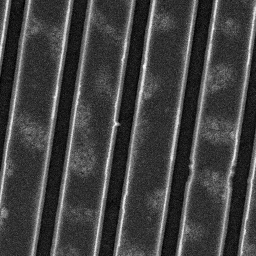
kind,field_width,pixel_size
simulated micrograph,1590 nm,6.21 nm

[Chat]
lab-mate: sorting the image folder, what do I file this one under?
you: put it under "one or a few lines or trenches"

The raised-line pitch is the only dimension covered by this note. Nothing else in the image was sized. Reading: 383 nm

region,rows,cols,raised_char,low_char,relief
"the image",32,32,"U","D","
UDDUUUUUUDDUUUUUUDDUUUUUDDDUUUUU
UDDUUUUUUDDUUUUUUDDUUUUUDDDUUUUU
UDDUUUUUUDDUUUUUDDDUUUUUDDDUUUUU
UDDUUUUUDDDUUUUUDDDUUUUUDDUUUUUU
UDDUUUUUDDDUUUUUDDUUUUUUDDUUUUUU
DDDUUUUUDDUUUUUUDDUUUUUUDDUUUUUD
DDDUUUUUDDUUUUUUDDUUUUUUDDUUUUUD
DDUUUUUUDDUUUUUUDDUUUUUDDDUUUUUD
DDUUUUUUDDUUUUUDDDUUUUUDDDUUUUUD
DDUUUUUDDDUUUUUDDDUUUUUDDDUUUUUD
DDUUUUUDDDUUUUUDDDUUUUUDDUUUUUUD
DDUUUUUDDDUUUUUDDUUUUUUDDUUUUUUD
DDUUUUUDDUUUUUUDDUUUUUUDDUUUUUDD
DUUUUUUDDUUUUUUDDUUUUUUDDUUUUUDD
DUUUUUUDDUUUUUUDDUUUUUDDDUUUUUDD
DUUUUUUDDUUUUUUDDUUUUUDDDUUUUUDD
DUUUUUUDDUUUUUDDDUUUUUDDUUUUUUDD
DUUUUUDDDUUUUUDDUUUUUUDDUUUUUUDD
DUUUUUDDDUUUUUDDUUUUUUDDUUUUUUDD
DUUUUUDDUUUUUUDDUUUUUUDDUUUUUDDD
UUUUUUDDUUUUUUDDUUUUUUDDUUUUUDDD
UUUUUUDDUUUUUDDDUUUUUDDDUUUUUDDU
UUUUUUDDUUUUUDDDUUUUUDDDUUUUUDDU
UUUUUUDDUUUUUDDDUUUUUDDUUUUUUDDU
UUUUUDDDUUUUUDDUUUUUUDDUUUUUUDDU
UUUUUDDDUUUUUDDUUUUUUDDUUUUUUDDU
UUUUUDDUUUUUUDDUUUUUUDDUUUUUDDDU
UUUUUDDUUUUUUDDUUUUUDDDUUUUUDDDU
UUUUUDDUUUUUUDDUUUUUDDDUUUUUDDUU
UUUUUDDUUUUUDDDUUUUUDDDUUUUUDDUU
UUUUDDDUUUUUDDDUUUUUDDUUUUUUDDUU
UUUUDDDUUUUUDDUUUUUUDDUUUUUUDDUU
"